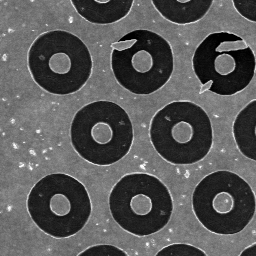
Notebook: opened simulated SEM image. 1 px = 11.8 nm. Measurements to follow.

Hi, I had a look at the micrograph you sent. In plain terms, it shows ring-shaped grooves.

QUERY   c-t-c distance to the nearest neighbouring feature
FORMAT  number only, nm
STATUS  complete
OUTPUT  945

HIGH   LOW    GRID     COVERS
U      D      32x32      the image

UUUUUUUUUDDDDDDDDUUDDDDDDDUUUDDD
UUUUUUUUUUDDDDDDUUUUDDDDDDUUUUDD
UUUUUUUUUUUDDDDUUUUUUDDDDUUUUUUD
UUUUUUUUUUUUUUUUUUUUUUUUUUUUUUUU
UUUUUDDDDUUUUUUDDDDDUUUUUUDDDUUU
UUUUDDDDDDDUUUUUUDDDDUUUUDDDUUUU
UUUUDDDDDDDUUUDDDUDDDDUUDDDUUDDD
UUUUDDUUUDDUUUDDUUUDDDUUDDDUUDDD
UUUUDDUUUDDUUUDDDUUDDDUUDDDUUDDD
UUUUDDDDDDDUUUDDDDDDDUUUUDDDDDDD
UUUUUDDDDDDUUUUDDDDDDUUUUUDDDDDU
UUUUUUDDDUUUUUUUUDDUUUUUUUUDDDUU
UUUUUUUUUUUUUUUUUUUUUUUUUUUUUUUU
UUUUUUUUUUDDDDDUUUUUDDDDDUUUUUDD
UUUUUUUUUDDDDDDDUUUDDDDDDDUUUUDD
UUUUUUUUUDDDUDDDUUUDDDUUDDUUUDDD
UUUUUUUUUDDDUUDDDUUDDDUUDDUUUDDD
UUUUUUUUUDDDUUDDDUUDDDUUDDUUUDDD
UUUUUUUUUDDDDDDDUUUDDDDDDDUUUUDD
UUUUUUUUUUDDDDDUUUUUDDDDDDUUUUUD
UUUUUUUUUUUUDDUUUUUUUUDUUUUUUUUU
UUUUUUUUUUUUUUUUUUUUUUUUUUUDDUUU
UUUUUDDDDUUUUUUDDDDDUUUUUDDDDDUU
UUUUDDDDDDDUUUDDDDDDDUUUDDDDDDDU
UUUUDDDUDDDUUUDDDUDDDUUUDDDUUDDD
UUUDDDUUUDDUUUDDUUUDDUUUDDDUUDDD
UUUUDDDUUDDUUUDDDUUDDUUUDDDUDDDD
UUUUDDDDDDDUUUDDDDDDDUUUUDDDDDDU
UUUUUDDDDDUUUUUDDDDDUUUUUUDDDDUU
UUUUUUUDDUUUUUUUUUUUUUUUUUUUUUUU
UUUUUUUUUUUUUUUUUUUUUUDUUUUUUUUU
UUUUUUUUUUDDDDDUUUUUDDDDDUUUUUDD